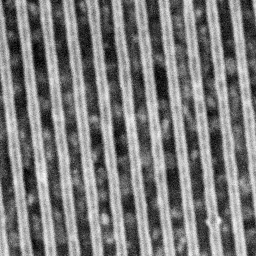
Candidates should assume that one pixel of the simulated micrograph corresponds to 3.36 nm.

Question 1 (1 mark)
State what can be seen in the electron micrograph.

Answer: parallel lines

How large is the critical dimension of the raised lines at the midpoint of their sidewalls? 8.93 pixels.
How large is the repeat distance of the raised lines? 79.3 nanometres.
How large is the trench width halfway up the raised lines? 49 nm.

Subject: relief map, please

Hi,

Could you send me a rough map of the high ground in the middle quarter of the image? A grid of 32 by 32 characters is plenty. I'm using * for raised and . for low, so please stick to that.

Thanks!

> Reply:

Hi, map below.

..**....**....**....**....**....
..**....**....**....**....**....
..**....**....**....**....**....
...*....**....***...**....**....
...**....**...***...**....**....
...**....**...***....**...**....
...**....**....**....**...***...
...**....**....**....**....**...
...**....**....**....**....**...
...**....**....**....**....**...
...**....**....**....**....**...
...**....**....**....**....**...
...**....***...**....**....**...
....**...***...**....**....**...
....**...***....**....*.....**..
....**....**....**....**....**..
....**....**....**....**....**..
....**....**....**....**....**..
....**....**....**....**....**..
....**....**....**....**....**..
*...**....**....**....**....**..
*...**....**....**....***...**..
*....*.....**...***...***...**..
*....**....**....**...***....**.
*....**....**....**....**....**.
*....**....**....**....**....**.
*....**....**....**....**....**.
*....**....**....**....**....**.
*....**....**....**....**....**.
**...***...**....**....**....**.
**....**....**...***...**....**.
**....**....**....**...**....***